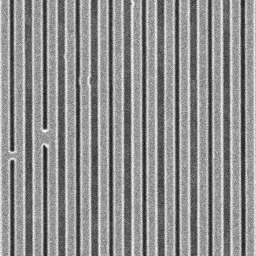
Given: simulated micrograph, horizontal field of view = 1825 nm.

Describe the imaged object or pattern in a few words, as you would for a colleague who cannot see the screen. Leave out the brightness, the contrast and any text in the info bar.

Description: parallel lines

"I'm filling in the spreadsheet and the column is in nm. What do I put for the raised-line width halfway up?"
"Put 70.4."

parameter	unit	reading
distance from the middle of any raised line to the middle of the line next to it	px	16.5